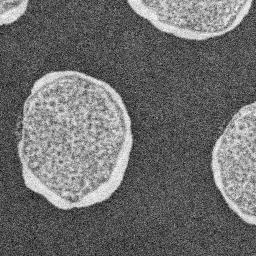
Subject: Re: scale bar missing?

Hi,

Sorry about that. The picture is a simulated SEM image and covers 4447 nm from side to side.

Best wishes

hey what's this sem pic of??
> raised bodies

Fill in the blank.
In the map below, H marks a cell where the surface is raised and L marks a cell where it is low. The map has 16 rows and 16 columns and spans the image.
HLLLLLLLLHHHHHHL
LLLLLLLLLLHHHHHL
LLLLLLLLLLLLLLLL
LLLLLLLLLLLLLLLL
LLLLLLLLLLLLLLLL
LLHHHHHLLLLLLLLL
LLHHHHHHLLLLLLLL
LHHHHHHHLLLLLLHH
LHHHHHHHLLLLLLHH
LHHHHHHHLLLLLHHH
LLHHHHHHLLLLLHHH
LLHHHHHLLLLLLLHH
LLLHHHLLLLLLLLHH
LLLLLLLLLLLLLLLH
LLLLLLLLLLLLLLLL
LLLLLLLLLLLLLLLL